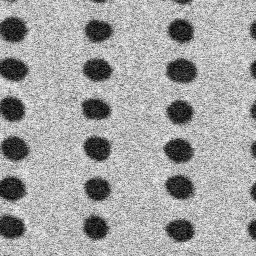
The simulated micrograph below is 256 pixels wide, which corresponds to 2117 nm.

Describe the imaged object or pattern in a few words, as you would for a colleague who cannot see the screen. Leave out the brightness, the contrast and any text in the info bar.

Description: a regular array of holes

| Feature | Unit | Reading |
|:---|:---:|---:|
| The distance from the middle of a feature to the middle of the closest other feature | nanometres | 322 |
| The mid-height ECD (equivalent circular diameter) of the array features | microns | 0.221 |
